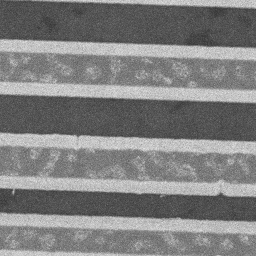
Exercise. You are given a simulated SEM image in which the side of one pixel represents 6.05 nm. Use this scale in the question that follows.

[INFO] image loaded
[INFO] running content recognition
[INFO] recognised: one or a few lines or trenches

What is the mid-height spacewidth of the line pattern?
300 nm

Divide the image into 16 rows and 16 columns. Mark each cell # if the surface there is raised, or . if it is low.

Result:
................
................
................
################
################
################
................
................
................
################
################
....############
................
................
################
################